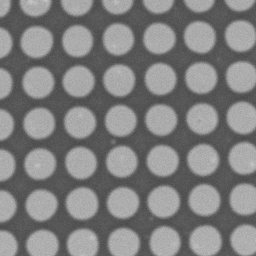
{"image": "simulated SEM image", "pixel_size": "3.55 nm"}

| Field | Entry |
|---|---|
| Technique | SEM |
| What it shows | an array of small figures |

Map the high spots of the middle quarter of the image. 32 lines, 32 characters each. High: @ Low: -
---@--------@@@-------@@@@------
-@@@@@-----@@@@@@----@@@@@@----@
@@@@@@@---@@@@@@@---@@@@@@@@--@@
@@@@@@@@--@@@@@@@@--@@@@@@@@--@@
@@@@@@@@--@@@@@@@@--@@@@@@@@---@
@@@@@@@---@@@@@@@----@@@@@@@---@
@@@@@@@----@@@@@@----@@@@@@-----
-@@@@@------@@@@-------@@-------
--------------------------------
--------------------------------
-------------@@--------@@@------
--@@@@-----@@@@@@----@@@@@@----@
-@@@@@@----@@@@@@@---@@@@@@@---@
@@@@@@@@--@@@@@@@@--@@@@@@@@---@
@@@@@@@@--@@@@@@@@---@@@@@@@---@
@@@@@@@@---@@@@@@@---@@@@@@@---@
-@@@@@@----@@@@@@----@@@@@@-----
-@@@@@@-----@@@@-------@@@------
--------------------------------
--------------------------------
------------------------@-------
--@@@@------@@@@@-----@@@@@-----
-@@@@@@----@@@@@@@---@@@@@@@---@
-@@@@@@@---@@@@@@@---@@@@@@@@--@
-@@@@@@@---@@@@@@@---@@@@@@@@--@
-@@@@@@@---@@@@@@@---@@@@@@@---@
-@@@@@@@---@@@@@@@----@@@@@@----
--@@@@@-----@@@@@------@@@@-----
---@@@--------------------------
--------------------------------
--------------------------------
---@@@@------@@@@-----@@@@@@----